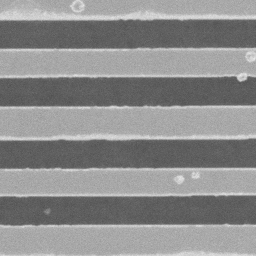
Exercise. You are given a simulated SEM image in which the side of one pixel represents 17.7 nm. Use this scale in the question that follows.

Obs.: lines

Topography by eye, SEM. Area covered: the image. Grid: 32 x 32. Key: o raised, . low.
oooooooooooooooooooooooooooooooo
oooooooooooooooooooooooooooooooo
................................
................................
................................
................................
oooooooooooooooooooooooooooooooo
oooooooooooooooooooooooooooooooo
oooooooooooooooooooooooooooooooo
oooooooooooooooooooooooooooo.oo.
................................
................................
................................
oooooooooooooooooooooooooooooooo
oooooooooooooooooooooooooooooooo
oooooooooooooooooooooooooooooooo
oooooooooooooooooooooooooooooooo
................................
................................
................................
................................
oooooooooooooooooooooooooooooooo
oooooooooooooooooooooooooooooooo
oooooooooooooooooooooooooooooooo
................................
................................
................................
................................
oooooooooooooooooooooooooooooooo
oooooooooooooooooooooooooooooooo
oooooooooooooooooooooooooooooooo
oooooooooooooooooooooooooooooooo